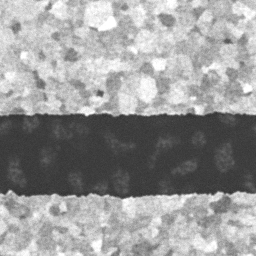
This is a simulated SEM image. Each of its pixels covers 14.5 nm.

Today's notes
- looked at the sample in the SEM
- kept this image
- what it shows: one or a few lines or trenches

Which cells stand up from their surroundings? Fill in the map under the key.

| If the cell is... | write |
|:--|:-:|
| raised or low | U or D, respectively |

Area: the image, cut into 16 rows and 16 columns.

UUUUUUUUUUUUUUUU
UUUUUUUUUUUUUUUU
UUUUUUUUUUUUUUUU
UUUUUUUUUUUUUUUU
UUUUUUUUUUUUUUUU
UUUUUUUUUUUUUUUU
UUUUUUUUUUUUUUUU
DDDDDDDDDDDDDDDD
DDDDDDDDDDDDDDDD
DDDDDDDDDDDDDDDD
DDDDDDDDDDDDDDDD
DDDDDDDDDDDDDDDD
UUUUUUUUUUUUUUUU
UUUUUUUUUUUUUUUU
UUUUUUUUUUUUUUUU
UUUUUUUUUUUUUUUU